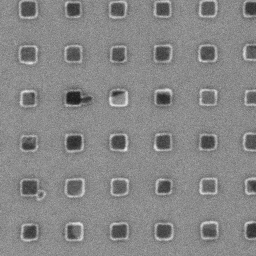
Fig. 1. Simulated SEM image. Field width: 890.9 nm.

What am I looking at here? a regular array of raised bodies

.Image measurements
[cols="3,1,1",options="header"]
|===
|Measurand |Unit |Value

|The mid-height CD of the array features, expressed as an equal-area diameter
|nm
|63.5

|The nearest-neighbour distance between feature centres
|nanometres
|154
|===